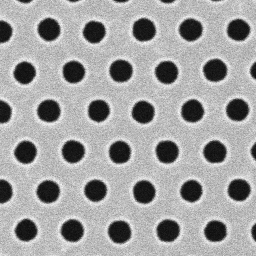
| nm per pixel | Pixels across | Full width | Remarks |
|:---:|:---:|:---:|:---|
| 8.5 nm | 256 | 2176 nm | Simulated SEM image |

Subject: a regular array of holes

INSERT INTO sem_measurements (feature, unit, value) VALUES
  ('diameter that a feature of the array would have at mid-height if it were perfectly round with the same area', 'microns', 0.202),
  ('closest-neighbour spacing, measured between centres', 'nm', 385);